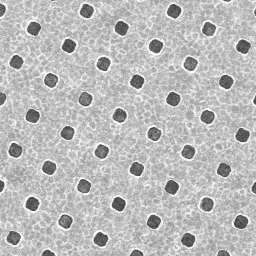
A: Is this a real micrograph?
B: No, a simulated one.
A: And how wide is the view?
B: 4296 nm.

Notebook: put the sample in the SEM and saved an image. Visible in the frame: a regular array of holes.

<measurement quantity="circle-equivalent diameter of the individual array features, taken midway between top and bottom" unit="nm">240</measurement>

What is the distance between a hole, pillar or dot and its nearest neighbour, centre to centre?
648 nm